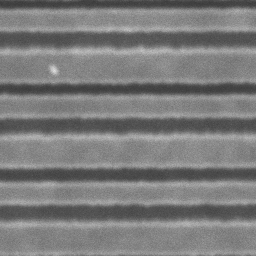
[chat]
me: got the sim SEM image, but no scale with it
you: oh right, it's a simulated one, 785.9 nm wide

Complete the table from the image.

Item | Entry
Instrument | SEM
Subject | lines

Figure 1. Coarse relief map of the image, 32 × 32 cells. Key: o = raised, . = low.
................................
oooooooooooooooooooooooooooooooo
oooooooooooooooooooooooooooooooo
oooooooooooooooooooooooooooooooo
................................
................................
oooooooooooooooooooooooooooooooo
oooooooooooooooooooooooooooooooo
oooooooooooooooooooooooooooooooo
oooooooooooooooooooooooooooooooo
................................
................................
oooooooooooooooooooooooooooooooo
oooooooooooooooooooooooooooooooo
oooooooooooooooooooooooooooooooo
................................
................................
oooooooooooooooooooooooooooooooo
oooooooooooooooooooooooooooooooo
oooooooooooooooooooooooooooooooo
oooooooooooooooooooooooooooooooo
................................
................................
oooooooooooooooooooooooooooooooo
oooooooooooooooooooooooooooooooo
...oo......o.o....o.........o...
................................
................................
oooooooooooooooooooooooooooooooo
oooooooooooooooooooooooooooooooo
oooooooooooooooooooooooooooooooo
oooooooooooooooooooooooooooooooo